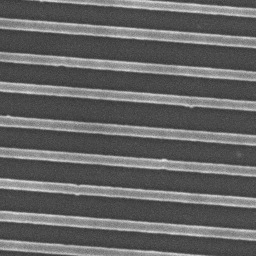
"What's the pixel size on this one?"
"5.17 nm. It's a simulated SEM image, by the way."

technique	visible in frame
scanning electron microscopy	parallel lines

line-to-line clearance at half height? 22.2 px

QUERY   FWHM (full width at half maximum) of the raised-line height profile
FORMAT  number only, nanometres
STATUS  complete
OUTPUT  47.6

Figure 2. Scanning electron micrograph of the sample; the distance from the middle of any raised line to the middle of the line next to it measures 0.164 µm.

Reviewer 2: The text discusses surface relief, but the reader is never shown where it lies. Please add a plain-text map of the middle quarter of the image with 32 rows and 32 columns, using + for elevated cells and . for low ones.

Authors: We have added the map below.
.+++++++++++++++++++++++++++....
..............++++++++++++++++++
...........................+++++
................................
................................
................................
+++++++.+.......................
++++++++++++++++++++++..........
........++++++++++++++++++++++++
.....................+++++++++++
...............................+
................................
................................
................................
++..............................
+++++++++++++++.................
.+++++++++++++++++++++++++++....
...........++.++++++++++++++++++
........................++.+++++
................................
................................
................................
++++............................
+++++++++++++++++...............
..++++++++++++++++++++++++++++..
...............+++++++++++++++++
............................++++
................................
................................
................................
+++.+...........................
++++++++++++++++++..............